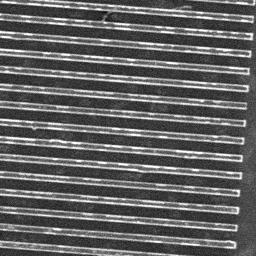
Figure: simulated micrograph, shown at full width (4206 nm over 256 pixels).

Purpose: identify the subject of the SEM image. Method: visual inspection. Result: parallel lines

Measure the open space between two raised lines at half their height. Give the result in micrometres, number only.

0.186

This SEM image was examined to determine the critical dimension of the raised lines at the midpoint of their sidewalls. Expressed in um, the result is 0.1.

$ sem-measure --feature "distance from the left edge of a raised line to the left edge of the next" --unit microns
0.286